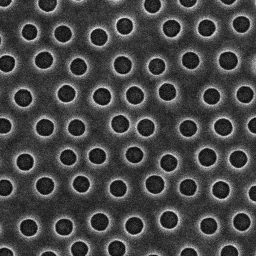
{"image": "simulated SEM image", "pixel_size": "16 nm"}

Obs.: a regular array of holes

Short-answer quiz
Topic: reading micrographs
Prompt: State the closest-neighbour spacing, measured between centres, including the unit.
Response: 510 nanometers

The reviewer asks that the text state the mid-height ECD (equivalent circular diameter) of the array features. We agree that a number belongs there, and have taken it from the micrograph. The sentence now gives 0.289 um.